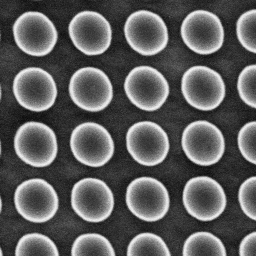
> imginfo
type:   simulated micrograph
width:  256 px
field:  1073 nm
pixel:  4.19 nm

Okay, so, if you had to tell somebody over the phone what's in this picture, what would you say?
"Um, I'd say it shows a regular array of raised bodies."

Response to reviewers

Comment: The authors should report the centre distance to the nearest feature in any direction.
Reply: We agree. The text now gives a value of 0.231 um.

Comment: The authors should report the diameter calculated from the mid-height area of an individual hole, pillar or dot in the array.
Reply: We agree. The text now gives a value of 174 nanometers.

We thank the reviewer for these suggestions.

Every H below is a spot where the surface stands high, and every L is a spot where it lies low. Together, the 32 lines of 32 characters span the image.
LLLLLLLLLLLLLLLLLLLLLLLLLLLLLLLL
LLLLLLLLLLLLLLLLLHLLLLLLLLLLLLLH
LLHHHHLLLHHHHLLLHHHHLLLHHHHLLLHH
LLHHHHHLLHHHHHLLHHHHHLLHHHHHLLHH
LLHHHHHLLHHHHHLLHHHHHLLHHHHHLLHH
LLHHHHHLLHHHHHLLHHHHHLLHHHHHLLHH
LLLHHHLLLLLHHLLLLLHLLLLLLHLLLLLL
LLLLLLLLLLLLLLLLLLLLLLLLLLLLLLLL
LLLLLLLLLLLLLLLLLHHLLLLLHHLLLLLH
LLHHHHLLLHHHHLLLHHHHLLLHHHHLLLHH
LLHHHHHLLHHHHHLLHHHHHLLHHHHHLLHH
LLHHHHHLLHHHHHLLHHHHHLLHHHHHLLHH
LLHHHHHLLHHHHHLLHHHHLLLHHHHHLLLH
LLLLHHLLLLLHHLLLLLHLLLLLLHHLLLLL
LLLLLLLLLLLLLLLLLLLLLLLLLLLLLLLL
LLLHHLLLLLLLLLLLLHHLLLLLHHLLLLLH
LLHHHHLLLHHHHLLLHHHHLLLHHHHLLLHH
LLHHHHHLLHHHHHLLHHHHHLLHHHHHLLHH
LLHHHHHLLHHHHHLLHHHHHLLHHHHHLLHH
LLLHHHHLLLHHHHLLLHHHHLLLHHHLLLLH
LLLLHHLLLLLHHLLLLLHLLLLLLHLLLLLL
LLLLLLLLLLLLLLLLLLLLLLLLLLLLLLLL
LLLLLLLLLLHHLLLLLHHLLLLLHHLLLLLH
LLHHHHLLLHHHHLLLHHHHLLLHHHHHLLHH
LLHHHHHLLHHHHHLLHHHHHLLHHHHHLLHH
LLHHHHHLLHHHHHLLHHHHHLLHHHHHLLHH
LLLHHHHLLLHHHHLLLHHHHLLLHHHHLLLH
LLLLHLLLLLLHHLLLLLLLLLLLLLLLLLLL
LLLLLLLLLLLLLLLLLLLLLLLLLLLLLLLL
LLLLHLLLLLHHLLLLLHHLLLLLHHHLLLLH
LLHHHHHLLHHHHHLLHHHHLLLHHHHHLLHH
LLHHHHHLLHHHHHLLHHHHHLLHHHHHLLHH